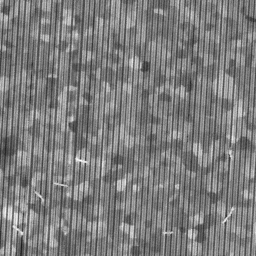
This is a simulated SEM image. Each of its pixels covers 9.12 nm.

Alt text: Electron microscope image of parallel lines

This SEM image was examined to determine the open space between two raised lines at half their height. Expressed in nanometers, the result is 23.9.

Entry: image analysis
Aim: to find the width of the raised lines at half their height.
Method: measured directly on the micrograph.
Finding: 31.9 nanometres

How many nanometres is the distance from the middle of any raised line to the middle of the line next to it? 48.6